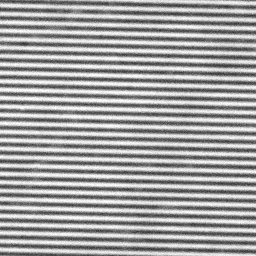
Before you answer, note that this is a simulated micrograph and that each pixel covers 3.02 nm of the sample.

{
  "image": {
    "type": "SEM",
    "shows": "parallel lines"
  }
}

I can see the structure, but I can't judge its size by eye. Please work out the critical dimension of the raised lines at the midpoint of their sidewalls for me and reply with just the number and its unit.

9.8 nm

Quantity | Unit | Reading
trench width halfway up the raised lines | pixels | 5.1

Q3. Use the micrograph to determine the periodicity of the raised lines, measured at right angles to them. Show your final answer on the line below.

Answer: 25.4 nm